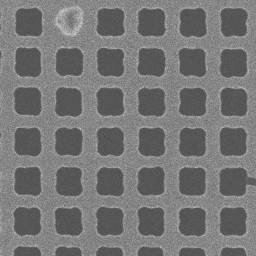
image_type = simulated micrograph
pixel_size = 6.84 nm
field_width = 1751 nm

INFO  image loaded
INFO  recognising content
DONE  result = a regular array of holes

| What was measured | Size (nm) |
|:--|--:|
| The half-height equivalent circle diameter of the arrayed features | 206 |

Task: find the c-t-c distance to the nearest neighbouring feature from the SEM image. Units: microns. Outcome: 0.269